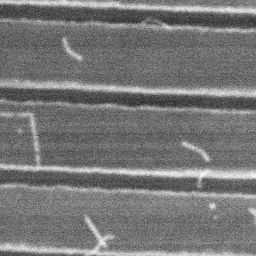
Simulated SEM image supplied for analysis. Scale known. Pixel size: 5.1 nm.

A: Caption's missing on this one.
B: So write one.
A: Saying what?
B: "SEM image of lines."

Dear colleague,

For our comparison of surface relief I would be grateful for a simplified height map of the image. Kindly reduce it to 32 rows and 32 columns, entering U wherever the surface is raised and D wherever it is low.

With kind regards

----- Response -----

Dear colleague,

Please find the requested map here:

DDDDDDUDUUUUUUUUUUUUUUUUUUUUUUUU
DDDDDDDDDDDDDDDDDDDDDDDDDDDDDDDD
DDDDDDDDDDDDDDDDDDDDDDDDDDDDDDDD
UUUUUUUUUUUUUUUUUUUUUUUUUDDDDDDD
UUUUUUUUUUUUUUUUUUUUUUUUUUUUUUUU
UUUUUUUUUUUUUUUUUUUUUUUUUUUUUUUU
UUUUUUUUUUUUUUUUUUUUUUUUUUUUUUUU
UUUUUUUUUUUUUUUUUUUUUUUUUUUUUUUU
UUUUUUUUUUUUUUUUUUUUUUUUUUUUUUUU
UUUUUUUUUUUUUUUUUUUUUUUUUUUUUUUU
UUUUUUUUUUUUUUUUUUUUUUUUUUUUUUUU
DDDDDDDDDDDDDDDDDDDDDDDUUUUUUUUU
DDDDDDDDDDDDDDDDDDDDDDDDDDDDDDDD
UUUUUUUUUUUUUUUUDUUUDDDDDDDDDDDD
UUUUUUUUUUUUUUUUUUUUUUUUUUUUUUUU
UUUUUUUUUUUUUUUUUUUUUUUUUUUUUUUU
UUUUUUUUUUUUUUUUUUUUUUUUUUUUUUUU
UUUUUUUUUUUUUUUUUUUUUUUUUUUUUUUU
UUUUUUUUUUUUUUUUUUUUUUUUUUUUUUUU
UUUUUUUUUUUUUUUUUUUUUUUUUUUUUUUU
UUUUUUUUUUUUUUUUUUUUUUUUUUUUUUUU
DDDDDDDDDDDDDUUUUUUUUUUUUUUUUUUU
DDDDDDDDDDDDDDDDDDDDDDDDDDDDDDDD
UUUUUUUUUDDDDDDDDDDDDDDDDDDDDDDD
UUUUUUUUUUUUUUUUUUUUUUUUUUUUUUUU
UUUUUUUUUUUUUUUUUUUUUUUUUUUUUUUU
UUUUUUUUUUUUUUUUUUUUUUUUUUUUUUUU
UUUUUUUUUUUUUUUUUUUUUUUUUUUUUUUU
UUUUUUUUUUUUUUUUUUUUUUUUUUUUUUUU
UUUUUUUUUUUUUUUUUUUUUUUUUUUUUUUU
UUUUUUUUUUUUUUUUUUUUUUUUUUUUUUUU
DDDDDDDDUUUUUUUUUUUUUUUUUUUUUUUU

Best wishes